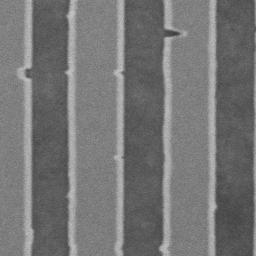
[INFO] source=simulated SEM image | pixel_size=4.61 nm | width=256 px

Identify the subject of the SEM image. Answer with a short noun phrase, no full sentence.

one or a few lines or trenches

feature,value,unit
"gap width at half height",208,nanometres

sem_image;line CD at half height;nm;220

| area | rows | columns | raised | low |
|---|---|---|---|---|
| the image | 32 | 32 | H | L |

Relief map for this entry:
HHHHLLLLLHHHHHHLLLLLLHHHHHHLLLLL
HHHHLLLLLHHHHHHLLLLLLHHHHHHLLLLL
HHHHLLLLLHHHHHHLLLLLLHHHHHHLLLLL
HHHLLLLLLHHHHHHLLLLLLHHHHHHLLLLL
HHHLLLLLLHHHHHHLLLLLLLHHHHHLLLLL
HHHLLLLLLHHHHHHLLLLLLHHHHHHLLLLL
HHHLLLLLLHHHHHHLLLLLLHHHHHHLLLLL
HHHLLLLLLHHHHHHLLLLLLHHHHHHLLLLL
HHHLLLLLLHHHHHHLLLLLLHHHHHHLLLLL
HHHLLLLLLHHHHHHLLLLLLHHHHHHLLLLL
HHHLLLLLLHHHHHHLLLLLLHHHHHHLLLLL
HHHLLLLLLHHHHHHLLLLLLHHHHHHLLLLL
HHHLLLLLLHHHHHHLLLLLLHHHHHLLLLLL
HHHLLLLLLHHHHHHLLLLLLHHHHHHLLLLL
HHHHLLLLLHHHHHHLLLLLLHHHHHHLLLLL
HHHLLLLLLHHHHHHLLLLLLHHHHHHLLLLL
HHHLLLLLLHHHHHHLLLLLLHHHHHHLLLLL
HHHLLLLLLHHHHHHLLLLLLHHHHHHLLLLL
HHHHLLLLLHHHHHHLLLLLLHHHHHHLLLLL
HHHHLLLLLHHHHHHLLLLLLHHHHHLLLLLL
HHHHLLLLLHHHHHHLLLLLLHHHHHHLLLLL
HHHHLLLLLHHHHHHLLLLLLHHHHHHLLLLL
HHHHLLLLLHHHHHHLLLLLLHHHHHHLLLLL
HHHHLLLLLHHHHHHLLLLLLHHHHHLLLLLL
HHHHLLLLLHHHHHHLLLLLLHHHHHLLLLLL
HHHHLLLLLHHHHHHLLLLLLHHHHHHLLLLL
HHHHLLLLLHHHHHHLLLLLLHHHHHLLLLLL
HHHLLLLLLHHHHHHLLLLLLHHHHHLLLLLL
HHHHLLLLLHHHHHHLLLLLLHHHHHLLLLLL
HHHHLLLLLHHHHHHLLLLLLHHHHHLLLLLL
HHHHLLLLLHHHHHHLLLLLLHHHHHLLLLLL
HHHLLLLLLHHHHHHLLLLLLHHHHHHLLLLL